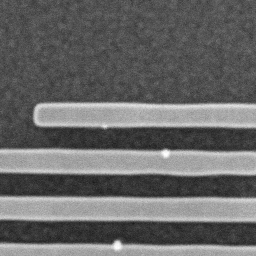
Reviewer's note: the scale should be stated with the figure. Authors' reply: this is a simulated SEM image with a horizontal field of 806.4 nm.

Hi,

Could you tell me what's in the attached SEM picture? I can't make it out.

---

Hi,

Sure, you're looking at groups of lines, slits or small figures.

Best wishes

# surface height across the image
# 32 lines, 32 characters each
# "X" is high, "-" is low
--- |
--------------------------------
--------------------------------
--------------------------------
--------------------------------
--------------------------------
--------------------------------
--------------------------------
--------------------------------
--------------------------------
--------------------------------
--------------------------------
--------------------------------
--------------------------------
----XXXXXXXXXXXXXXXXXXXXXXXXXXXX
----XXXXXXXXXXXXXXXXXXXXXXXXXXXX
-----XXXXXXXXXXXXXXXXXXXXXXXXXXX
--------------------------------
--------------------------------
--------------------------------
XXXXXXXXXXXXXXXXXXXXXXXXXXXXXXXX
XXXXXXXXXXXXXXXXXXXXXXXXXXXXXXXX
XXXXXXXXXXXXXXXXXXXXXXXXXXXXXXXX
--------------------------------
--------------------------------
--------------------------------
XXXXXXXXXXXXXXXXXXXXXXXXXXXXXXXX
XXXXXXXXXXXXXXXXXXXXXXXXXXXXXXXX
-------------XX---XXXXXXXXXXXXXX
--------------------------------
--------------------------------
XXXX----------XX----------------
XXXXXXXXXXXXXXXXXXXXXXXXXXXXXXXX